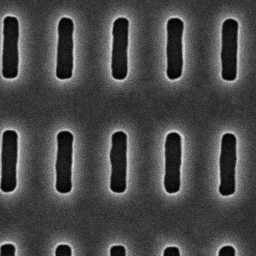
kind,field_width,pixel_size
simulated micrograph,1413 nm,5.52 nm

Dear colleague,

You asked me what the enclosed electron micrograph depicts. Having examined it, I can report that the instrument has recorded a regular array of holes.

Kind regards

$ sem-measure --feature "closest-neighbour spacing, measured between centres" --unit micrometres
0.301